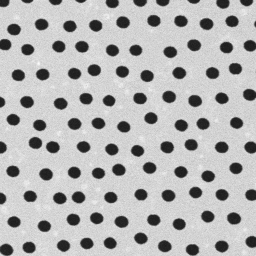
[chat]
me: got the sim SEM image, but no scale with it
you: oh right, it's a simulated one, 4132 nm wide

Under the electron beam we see a regular array of holes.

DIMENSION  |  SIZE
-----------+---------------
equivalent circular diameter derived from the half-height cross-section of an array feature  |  204 nm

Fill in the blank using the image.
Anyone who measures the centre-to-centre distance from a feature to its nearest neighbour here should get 380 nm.